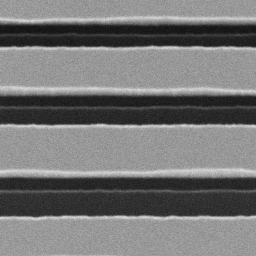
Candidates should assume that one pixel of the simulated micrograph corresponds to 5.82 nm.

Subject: lines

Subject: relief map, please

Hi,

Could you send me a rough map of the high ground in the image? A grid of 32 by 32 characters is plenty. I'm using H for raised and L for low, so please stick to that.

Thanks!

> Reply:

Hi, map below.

HHHHHHHHHHHHHHHHHHHHHHHHHHHHHHHH
HHHHHHHHHHHHHHHHHHHHHHHHHHHHHHHH
HHHHHHHHHHHHHHHHHHHHHHHHHHHHHHHH
LLLLLLLLLLLLLLLLLLLLLLLLLLLLLLLL
LLLLLLLLLLLLLLLLLLLLLLLLLLLLLLLL
LLLLLLLLLLLLLLLLLLLLLLLLLLLLLLLL
HHHHHHHHHHHHHHHHHHHHHHHHHHHHHHHH
HHHHHHHHHHHHHHHHHHHHHHHHHHHHHHHH
HHHHHHHHHHHHHHHHHHHHHHHHHHHHHHHH
HHHHHHHHHHHHHHHHHHHHHHHHHHHHHHHH
HHHHHHHHHHHHHHHHHHHHHHHHHHHHHHHH
HHHHHHHHHHHHHHHHHHHHHHHHHHHHHHHH
LLLLLLLLLLLLLLLLLLLLLLLLLLLLLLLL
LLLLLLLLLLLLLLLLLLLLLLLLLLLLLLLL
LLLLLLLLLLLLLLLLLLLLLLLLLLLLLLLL
LLLLLLLLLLLLLLLLLLLLLLLLLLLLLLLL
HHHHHHHHHHHHHHHHHHHHHHHHHHHHHHHH
HHHHHHHHHHHHHHHHHHHHHHHHHHHHHHHH
HHHHHHHHHHHHHHHHHHHHHHHHHHHHHHHH
HHHHHHHHHHHHHHHHHHHHHHHHHHHHHHHH
HHHHHHHHHHHHHHHHHHHHHHHHHHHHHHHH
HHHHHHHHHHHHHHHHHHHHHHHHHHHHHHHH
LLLLLLLLLLLLLLLLLLLLLLLLLLLLLLLL
LLLLLLLLLLLLLLLLLLLLLLLLLLLLLLLL
LLLLLLLLLLLLLLLLLLLLLLLLLLLLLLLL
LLLLLLLLLLLLLLLLLLLLLLLLLLLLLLLL
LLLLLLLLLLLLLLLLLLLLLLLLLLLLLLLL
HHHHHHHHHHHHHHHHHHHHHHHHHHHHHHHH
HHHHHHHHHHHHHHHHHHHHHHHHHHHHHHHH
HHHHHHHHHHHHHHHHHHHHHHHHHHHHHHHH
HHHHHHHHHHHHHHHHHHHHHHHHHHHHHHHH
HHHHHHHHHHHHHHHHHHHHHHHHHHHHHHHH